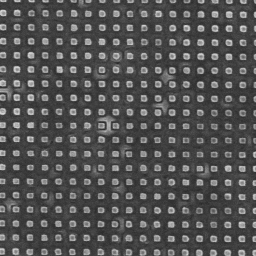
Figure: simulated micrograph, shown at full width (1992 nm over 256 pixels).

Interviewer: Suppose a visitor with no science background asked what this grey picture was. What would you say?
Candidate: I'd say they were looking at a regular array of raised bodies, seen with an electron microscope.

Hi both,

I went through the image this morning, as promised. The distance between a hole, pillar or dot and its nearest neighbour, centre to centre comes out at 0.108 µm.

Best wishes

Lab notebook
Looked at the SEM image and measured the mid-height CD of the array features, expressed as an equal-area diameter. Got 0.0473 microns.